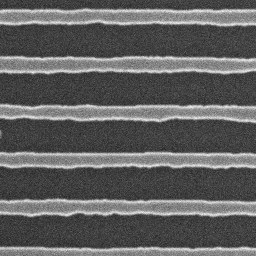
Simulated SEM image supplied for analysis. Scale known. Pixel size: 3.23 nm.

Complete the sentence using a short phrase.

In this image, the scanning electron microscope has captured lines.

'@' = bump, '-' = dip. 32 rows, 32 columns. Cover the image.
--------------------------------
@@@@@@@@@@@@@@@@@@@@@@@@@@@@@@@@
@@@@@@@@@@@@@@@@@@@@@@@@@@@@@@@@
--------------------------------
--------------------------------
--------------------------------
--------------------------------
@@@@@@@@@@@@@@@@@@@@@@@@@@@@@@@@
@@@@@@@@@@@@@@@@@@@@@@@@@@@@@@@@
--------------------------------
--------------------------------
--------------------------------
--------------------------------
@@@@@@@@@@@@@@@@@@@@@@@@@@@@@@@@
@@@@@@@@@@@@@@@@@@@@@@@@@@@@@@@@
--------------------------------
--------------------------------
--------------------------------
--------------------------------
@@@@@@@@@@@@@@@@@@@@@@@@@@@@@@@@
@@@@@@@@@@@@@@@@@@@@@@@@@@@@@@@@
--------------------------------
--------------------------------
--------------------------------
--------------------------------
@@@@@@@@@@@@@@@@@@@@@@@@@@@@@@@@
@@@@@@@@@@@@@@@@@@@@@@@@@@@@@@@@
--------------------------------
--------------------------------
--------------------------------
--------------------------------
@@@@@@@@@@@@@@@@@@@@@@@@@@@@@@@@